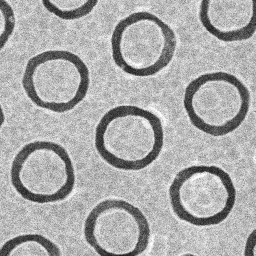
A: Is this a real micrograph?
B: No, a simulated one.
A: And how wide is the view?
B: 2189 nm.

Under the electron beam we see ring-shaped grooves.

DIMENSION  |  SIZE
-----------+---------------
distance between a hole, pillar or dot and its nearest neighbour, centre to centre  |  797 nm